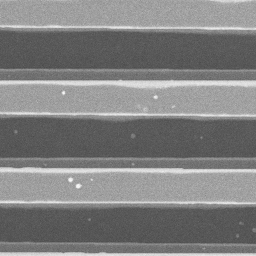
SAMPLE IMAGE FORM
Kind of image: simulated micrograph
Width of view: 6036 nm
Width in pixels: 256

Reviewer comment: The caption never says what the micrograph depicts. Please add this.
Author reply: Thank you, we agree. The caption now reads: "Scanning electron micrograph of lines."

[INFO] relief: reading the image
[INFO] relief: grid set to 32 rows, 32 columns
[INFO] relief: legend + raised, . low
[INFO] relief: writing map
++++++++++++++++++++++++++++++++
++++++++++++++++++++++++++++++++
++++++++++++++++++++++++++++++++
.............+++++++++++++++++++
................................
................................
................................
................................
................................
++++++++++++++++++++++++++++++++
++++++++++++++++++++++++++++++++
++++++++++++++++++++++++++++++++
++++++++++++++++++++++++++++++++
++++++++++++++++++++++++++++++++
................................
................................
................................
................................
................................
................................
++++++++++++++++++++++++++++++++
++++++++++++++++++++++++++++++++
++++++++++++++++++++++++++++++++
++++++++++++++++++++++++++++++++
++++++++++++++++++++++++++++++++
................................
................................
................................
................................
................................
++++++++++++....................
++++++++++++++++++++++++++++++++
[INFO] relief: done